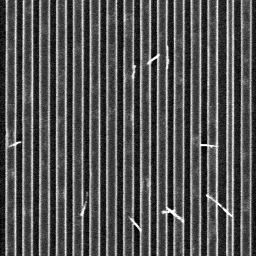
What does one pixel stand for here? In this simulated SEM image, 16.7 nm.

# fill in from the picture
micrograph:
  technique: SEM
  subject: parallel lines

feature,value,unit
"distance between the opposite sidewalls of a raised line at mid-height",9.38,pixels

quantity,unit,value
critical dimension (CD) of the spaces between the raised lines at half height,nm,115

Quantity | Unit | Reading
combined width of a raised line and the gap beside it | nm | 281